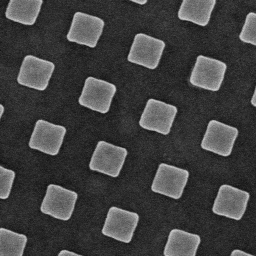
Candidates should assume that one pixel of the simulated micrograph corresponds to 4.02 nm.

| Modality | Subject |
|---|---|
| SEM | a regular array of raised bodies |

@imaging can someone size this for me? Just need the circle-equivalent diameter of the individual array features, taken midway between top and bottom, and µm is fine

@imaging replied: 0.135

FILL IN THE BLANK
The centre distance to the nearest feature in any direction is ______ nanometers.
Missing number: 260